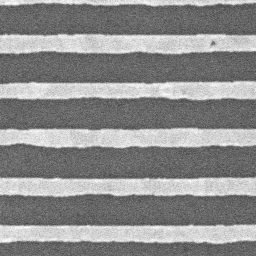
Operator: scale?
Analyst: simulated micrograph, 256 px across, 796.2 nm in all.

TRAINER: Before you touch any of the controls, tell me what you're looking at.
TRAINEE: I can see lines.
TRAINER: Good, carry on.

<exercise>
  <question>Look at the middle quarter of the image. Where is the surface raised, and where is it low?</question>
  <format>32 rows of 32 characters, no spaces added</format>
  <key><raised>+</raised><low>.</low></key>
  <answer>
................................
................................
................................
................................
................................
++++++++++++++++++++++++++++++++
+++++++++++++++++++++++++++++.++
+++++++++++++++++++++++++++++..+
+.........................+++.++
................................
................................
................................
................................
................................
................................
................................
++++++...++++++....+++++++++++++
++++.+++++++++++++++++++++++++++
++++++++++++++++++++++++++++++++
++++++++++++++++++++++++++++++++
+++++++..++++++++..+....+++++.++
................................
................................
................................
................................
................................
................................
................................
................................
++++++++++++++++++++++++++++++++
++++++++++++++++++++++++++++++++
++++++++++++++++++++++++++++++++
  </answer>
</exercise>